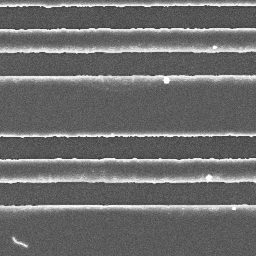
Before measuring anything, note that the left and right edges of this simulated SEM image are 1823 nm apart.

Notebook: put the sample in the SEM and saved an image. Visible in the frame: lines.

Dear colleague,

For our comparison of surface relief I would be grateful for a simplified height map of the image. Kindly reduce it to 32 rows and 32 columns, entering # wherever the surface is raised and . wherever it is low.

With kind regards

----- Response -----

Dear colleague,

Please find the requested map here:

################################
................................
................................
................................
################################
################################
.......#.##.....................
................................
................................
............................##..
################################
################################
################################
################################
################################
################################
################################
................................
................................
................................
################################
################################
##########.#####################
................................
................................
................................
################################
################################
################################
################################
################################
################################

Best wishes